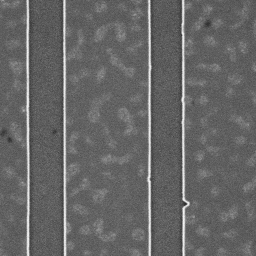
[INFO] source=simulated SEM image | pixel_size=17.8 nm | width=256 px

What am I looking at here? one or a few lines or trenches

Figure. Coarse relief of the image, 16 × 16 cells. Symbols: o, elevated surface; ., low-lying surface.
oo..ooooo..ooooo
oo..ooooo..ooooo
oo..ooooo..ooooo
oo..ooooo..ooooo
oo..ooooo..ooooo
oo..ooooo..ooooo
oo..ooooo..ooooo
oo..ooooo..ooooo
oo..ooooo..ooooo
oo..ooooo..ooooo
oo..ooooo..ooooo
oo..ooooo..ooooo
oo..ooooo...oooo
oo..ooooo...oooo
oo..ooooo..ooooo
oo..ooooo..ooooo